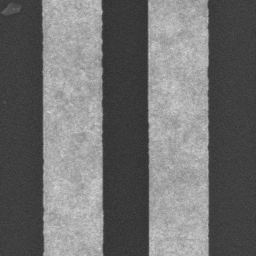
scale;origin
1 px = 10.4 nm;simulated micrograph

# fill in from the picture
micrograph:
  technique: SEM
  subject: lines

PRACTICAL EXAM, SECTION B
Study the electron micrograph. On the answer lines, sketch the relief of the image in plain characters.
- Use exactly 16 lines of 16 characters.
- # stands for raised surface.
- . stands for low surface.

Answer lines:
...###...####...
...###...####...
...###...####...
...###...####...
...###...####...
...###...####...
...###...####...
...###...####...
...###...####...
...###...####...
...###...####...
...###...####...
...###...####...
...###...####...
...###...####...
...###...####...